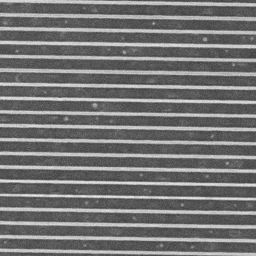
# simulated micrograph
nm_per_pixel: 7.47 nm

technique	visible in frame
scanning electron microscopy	parallel lines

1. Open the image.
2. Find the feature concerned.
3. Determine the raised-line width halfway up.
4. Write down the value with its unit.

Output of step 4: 19.6 nm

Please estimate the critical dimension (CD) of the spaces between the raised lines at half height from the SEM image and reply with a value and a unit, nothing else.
0.084 µm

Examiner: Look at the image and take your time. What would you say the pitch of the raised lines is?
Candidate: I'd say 104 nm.